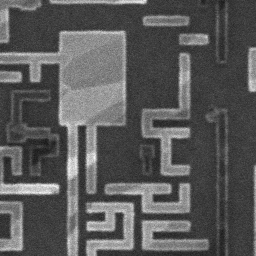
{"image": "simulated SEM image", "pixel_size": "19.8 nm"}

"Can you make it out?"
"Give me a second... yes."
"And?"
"wiring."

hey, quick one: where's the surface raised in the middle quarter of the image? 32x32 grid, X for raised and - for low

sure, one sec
XXXXXXXXXXXXXXX--------------XX-
XXXXXXXXXXXXXXX--------------XX-
XXXXXXXXXXXXXXX--------------XX-
XXXXXXXXXXXXXXX--------------XX-
XXXXXXXXXXXXXXX--------------XX-
XXXXXXXXXXXXXXX--------------XX-
XXXXXXXXXXXXXXX--------------XX-
XXXXXXXXXXXXXXX--------------XX-
XXXXXXXXXXXXXXX--------------XX-
XXXXXXXXXXXXXXX--------------XX-
XXXXXXXXXXXXXXX--------------XX-
XXXXXXXXXXXXXXX-----XX-XXXXXXXX-
XXXXXXXXXXXXXXX-----XXXXXXXXXXX-
XXXXXXXXXXXXXXX-----XXXXXXXXXXX-
XXXXXXXXXXXXXXX-----XX----------
-XX---XX------------XX----------
-XX---XX------------XXXXXXXXXXX-
-XX---XX------------XXXXXXXXXXX-
-XX---XX----------------XXX-----
-XX---XX----------------XX------
-XX---XX-----------XXX--XX------
-XX---XX-----------XXX--XX------
-XX---XX-----------XXX--XX------
-XX---XX-----------XXX--XX------
-XX---XX------------XX--XX------
-XX---XX------------XX--XXX-----
-XX---XX------------XX--XXXXXXX-
-XX---XX------------------XXXX--
-XX---XX------------------------
-XX---XX------------------------
-XX---XX---XXXXXXXXXXXXXXXX--XX-
-XX---XX--XXXXXXXXXXXXXXXXX--XX-